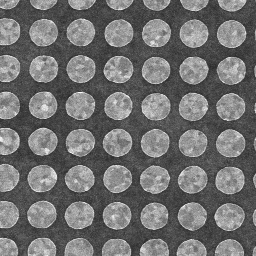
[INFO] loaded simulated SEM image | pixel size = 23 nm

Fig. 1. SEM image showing a regular array of raised bodies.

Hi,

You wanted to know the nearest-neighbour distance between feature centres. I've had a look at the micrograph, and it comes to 837 nm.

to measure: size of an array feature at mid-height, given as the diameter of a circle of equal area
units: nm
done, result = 640